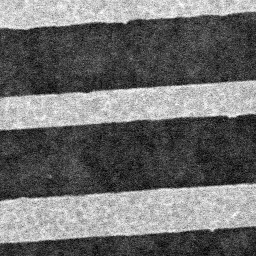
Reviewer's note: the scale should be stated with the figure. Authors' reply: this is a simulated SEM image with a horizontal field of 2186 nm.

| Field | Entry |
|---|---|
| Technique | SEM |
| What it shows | one or a few lines or trenches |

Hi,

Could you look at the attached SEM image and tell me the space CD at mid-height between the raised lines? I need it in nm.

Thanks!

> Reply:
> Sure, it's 598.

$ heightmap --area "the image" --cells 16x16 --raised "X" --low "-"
XXXXXXXXXXXXXXXX
XXXXX-----------
----------------
----------------
----------------
----------XXXXXX
XXXXXXXXXXXXXXXX
XXXXXXXXX-------
----------------
----------------
----------------
----------------
-XXXXXXXXXXXXXXX
XXXXXXXXXXXXXXXX
XXXXXXXXXX------
----------------